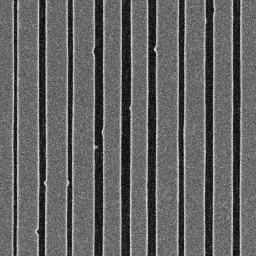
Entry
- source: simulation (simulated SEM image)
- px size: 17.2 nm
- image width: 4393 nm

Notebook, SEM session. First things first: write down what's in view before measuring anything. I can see parallel lines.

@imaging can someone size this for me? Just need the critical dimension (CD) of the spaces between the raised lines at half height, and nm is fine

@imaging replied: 124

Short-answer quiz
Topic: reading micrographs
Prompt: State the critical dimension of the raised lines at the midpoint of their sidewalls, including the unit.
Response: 0.36 um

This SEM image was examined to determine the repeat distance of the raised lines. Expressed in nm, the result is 478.